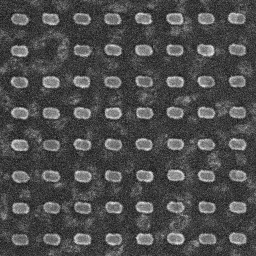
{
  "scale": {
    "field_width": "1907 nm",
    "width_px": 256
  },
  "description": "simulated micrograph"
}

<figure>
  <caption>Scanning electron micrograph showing a regular array of raised bodies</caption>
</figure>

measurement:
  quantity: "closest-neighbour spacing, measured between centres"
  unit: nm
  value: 230